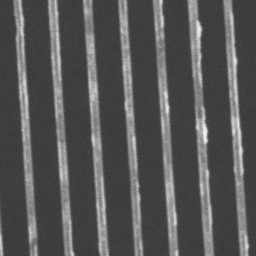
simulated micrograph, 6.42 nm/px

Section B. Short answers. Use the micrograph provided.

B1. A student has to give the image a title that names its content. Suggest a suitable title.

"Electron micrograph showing parallel lines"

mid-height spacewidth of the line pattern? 179 nm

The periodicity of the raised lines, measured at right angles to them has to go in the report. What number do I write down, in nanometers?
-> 225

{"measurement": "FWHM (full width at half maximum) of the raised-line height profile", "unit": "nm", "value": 47.2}